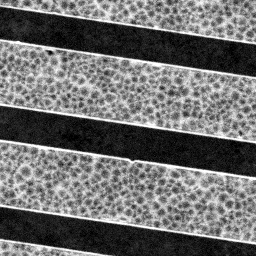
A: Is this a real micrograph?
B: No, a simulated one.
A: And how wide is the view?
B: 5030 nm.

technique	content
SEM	one or a few lines or trenches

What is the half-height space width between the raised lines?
34.6 pixels